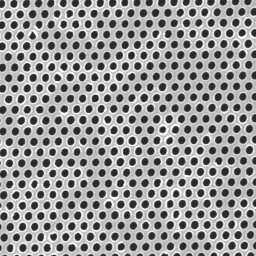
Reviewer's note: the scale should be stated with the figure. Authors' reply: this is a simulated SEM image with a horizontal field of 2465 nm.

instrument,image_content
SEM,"a regular array of holes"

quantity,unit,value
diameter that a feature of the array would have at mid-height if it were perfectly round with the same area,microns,0.0713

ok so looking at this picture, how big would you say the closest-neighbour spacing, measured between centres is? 0.114 microns